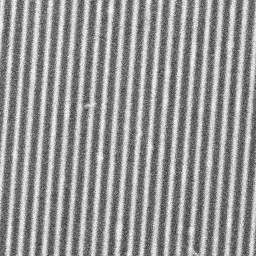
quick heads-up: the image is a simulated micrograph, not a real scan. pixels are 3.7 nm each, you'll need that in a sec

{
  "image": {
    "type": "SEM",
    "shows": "parallel lines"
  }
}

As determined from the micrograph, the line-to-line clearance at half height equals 0.0323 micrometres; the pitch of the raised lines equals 0.045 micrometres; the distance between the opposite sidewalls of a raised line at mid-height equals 14.3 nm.